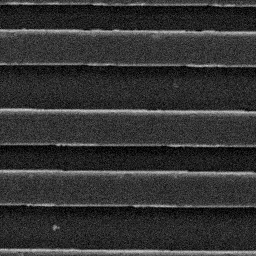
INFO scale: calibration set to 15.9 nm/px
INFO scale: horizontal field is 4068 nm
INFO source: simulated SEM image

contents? lines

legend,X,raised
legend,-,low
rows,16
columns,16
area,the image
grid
----------------
----------------
XXXXXXXXXXXXXXXX
XXXXXXXXXXXXXXXX
----------------
----------------
----------------
XXXXXXXXXXXXXXXX
XXXXXXXXXXXXXXXX
----------------
----------------
XXXXXXXXXXXXXXXX
XXXXXXXXXXXXXXXX
----------------
----------------
----------------